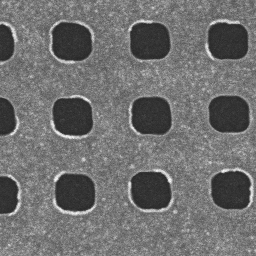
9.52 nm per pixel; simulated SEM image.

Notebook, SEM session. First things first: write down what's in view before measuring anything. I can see a regular array of holes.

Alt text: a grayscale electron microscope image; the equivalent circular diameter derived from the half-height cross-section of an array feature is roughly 0.39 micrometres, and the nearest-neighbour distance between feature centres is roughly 711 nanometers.